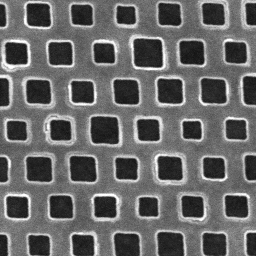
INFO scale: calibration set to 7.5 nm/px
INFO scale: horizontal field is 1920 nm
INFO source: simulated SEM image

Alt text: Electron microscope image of a regular array of holes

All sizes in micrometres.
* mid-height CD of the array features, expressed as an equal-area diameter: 0.193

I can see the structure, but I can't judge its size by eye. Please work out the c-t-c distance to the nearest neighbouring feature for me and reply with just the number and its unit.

327 nm